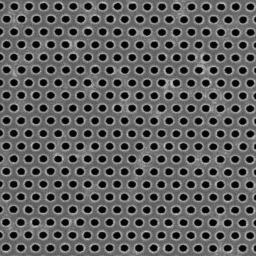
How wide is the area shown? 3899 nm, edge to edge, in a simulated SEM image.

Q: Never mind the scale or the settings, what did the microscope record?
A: a regular array of holes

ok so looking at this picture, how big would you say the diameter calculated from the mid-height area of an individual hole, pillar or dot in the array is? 0.118 um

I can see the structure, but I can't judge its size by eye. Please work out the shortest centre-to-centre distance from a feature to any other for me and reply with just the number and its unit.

219 nm